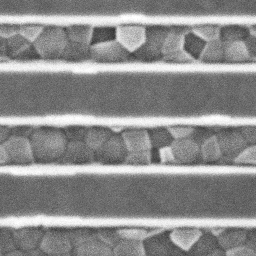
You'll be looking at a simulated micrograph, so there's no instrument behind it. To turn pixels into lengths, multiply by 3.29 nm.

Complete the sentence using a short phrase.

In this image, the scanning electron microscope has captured one or a few lines or trenches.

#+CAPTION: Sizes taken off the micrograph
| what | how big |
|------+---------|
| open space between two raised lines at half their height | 155 nm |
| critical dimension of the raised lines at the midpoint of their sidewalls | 178 nm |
